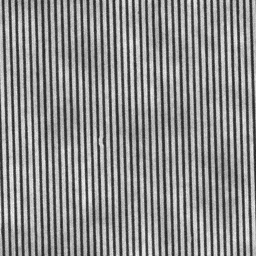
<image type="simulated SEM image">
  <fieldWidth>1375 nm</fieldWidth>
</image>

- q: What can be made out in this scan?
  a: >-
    parallel lines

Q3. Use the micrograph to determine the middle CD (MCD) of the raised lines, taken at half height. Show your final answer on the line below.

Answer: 18.1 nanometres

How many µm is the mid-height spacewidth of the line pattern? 0.0181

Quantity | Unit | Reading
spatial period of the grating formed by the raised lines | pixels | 6.52